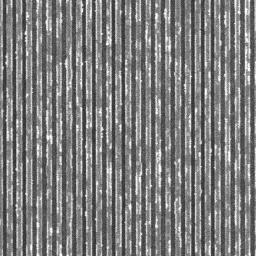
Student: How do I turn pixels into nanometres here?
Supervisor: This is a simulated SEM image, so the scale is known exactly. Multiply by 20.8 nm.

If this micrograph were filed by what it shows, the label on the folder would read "parallel lines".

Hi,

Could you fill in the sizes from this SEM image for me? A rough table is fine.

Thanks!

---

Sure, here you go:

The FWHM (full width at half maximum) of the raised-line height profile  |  0.122 µm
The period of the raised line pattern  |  0.206 um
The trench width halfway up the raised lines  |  101 nanometers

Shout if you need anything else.